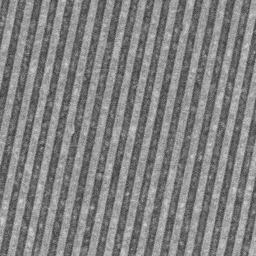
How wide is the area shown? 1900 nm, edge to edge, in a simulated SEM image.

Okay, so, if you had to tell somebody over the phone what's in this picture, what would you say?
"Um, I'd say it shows parallel lines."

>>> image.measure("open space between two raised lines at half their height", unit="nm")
69.1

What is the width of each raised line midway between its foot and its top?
48.2 nm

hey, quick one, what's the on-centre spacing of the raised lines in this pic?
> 0.117 µm